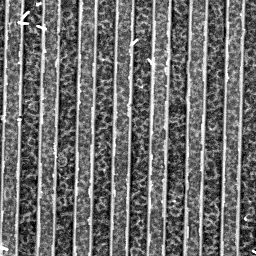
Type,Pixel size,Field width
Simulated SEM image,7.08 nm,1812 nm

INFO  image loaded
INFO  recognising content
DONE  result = parallel lines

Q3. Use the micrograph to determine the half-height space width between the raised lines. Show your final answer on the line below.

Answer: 21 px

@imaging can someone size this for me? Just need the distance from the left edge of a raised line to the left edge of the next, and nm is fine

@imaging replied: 261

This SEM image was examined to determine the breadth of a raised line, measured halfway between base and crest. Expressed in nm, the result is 113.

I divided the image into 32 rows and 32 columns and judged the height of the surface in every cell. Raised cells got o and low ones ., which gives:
.oo..oo...oo...oo..oo...oo..oo..
.oo..oo...oo...oo..oo...oo..oo..
.oo..oo...oo...oo..oo...oo..oo..
.oo..oo...oo...oo..oo...oo..oo..
.oo..oo...oo...oo..oo...oo..oo..
.oo..oo...oo...oo..oo...oo..oo..
.oo..oo...oo...oo..oo...oo..oo..
.oo..oo...oo..oo...oo...oo..oo..
.oo..oo...oo..oo...oo...oo..oo..
.oo..oo...oo..oo...oo...oo..oo..
.oo..oo...oo..oo...oo...oo..oo..
.oo..oo...oo..oo...oo...oo..oo..
.oo..oo...oo..oo...oo..ooo..oo..
.oo..oo...oo..oo...oo..oo...oo..
oo...oo...oo..oo...oo...o...oo..
oo...oo...oo..oo...oo...o...oo..
oo...oo...oo..oo...oo...o...oo..
oo...oo...oo..oo...oo..oo...oo..
oo...oo...oo..oo...oo..oo...oo..
oo...oo...oo..oo...oo..oo...oo..
oo...oo...oo..oo...oo..oo...oo..
oo...oo...oo..oo...oo..oo...oo..
oo...oo...o...oo...oo..oo...oo..
oo...oo...o...oo...oo..oo...oo..
oo...oo...o...oo...oo..oo...oo..
oo...oo...o...oo...oo..oo...oo..
oo...oo..oo...oo...oo..oo...oo..
oo...oo..oo...oo...oo..oo...oo..
oo...oo..oo...oo...o...oo...oo..
oo...oo..oo...oo...o...oo...oo..
oo...oo..oo...oo...o...oo...oo..
oo...oo..oo...oo...o...oo...oo..